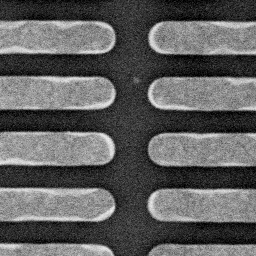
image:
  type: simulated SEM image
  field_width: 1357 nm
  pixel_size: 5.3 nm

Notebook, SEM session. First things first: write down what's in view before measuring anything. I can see groups of lines, slits or small figures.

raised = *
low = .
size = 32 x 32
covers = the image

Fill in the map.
................................
................................
................................
**************.....*************
**************.....*************
**************.....*************
......*****.........*******..***
................................
................................
................................
**************.....*************
**************.....*************
**************.....*************
**********.............*********
................................
................................
................................
**************.....*************
**************.....*************
**************.....*************
......*****.........************
................................
................................
................................
**************.....*************
**************.....*************
**************.....*************
**........**............********
................................
................................
................................
**************.....*************